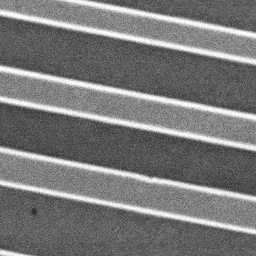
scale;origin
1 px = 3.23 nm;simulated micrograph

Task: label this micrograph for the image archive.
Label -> one or a few lines or trenches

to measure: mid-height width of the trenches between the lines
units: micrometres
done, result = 0.168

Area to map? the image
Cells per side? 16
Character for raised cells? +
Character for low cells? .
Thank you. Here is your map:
+++++++.........
...++++++++++...
........++++++++
..............++
++..............
+++++++.........
.+++++++++++....
......++++++++++
............++++
+...............
++++++..........
+++++++++++.....
.....+++++++++++
..........++++++
................
................